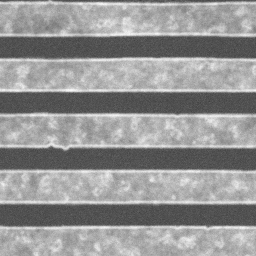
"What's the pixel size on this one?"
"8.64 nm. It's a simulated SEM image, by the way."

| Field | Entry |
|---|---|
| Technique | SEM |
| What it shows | parallel lines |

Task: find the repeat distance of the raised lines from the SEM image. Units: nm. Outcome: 483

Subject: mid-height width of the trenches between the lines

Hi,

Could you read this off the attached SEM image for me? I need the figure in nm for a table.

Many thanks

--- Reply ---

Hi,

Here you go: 214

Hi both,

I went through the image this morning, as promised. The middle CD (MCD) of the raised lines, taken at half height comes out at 271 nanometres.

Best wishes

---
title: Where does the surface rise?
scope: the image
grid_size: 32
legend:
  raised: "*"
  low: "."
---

***********................*****
********************************
********************************
********************************
................................
................................
................................
..............***************...
********************************
********************************
********************************
................................
................................
................................
*************************......*
********************************
********************************
********************************
................................
................................
................................
********************************
********************************
********************************
********************************
................................
................................
................................
*......*****************........
********************************
********************************
********************************